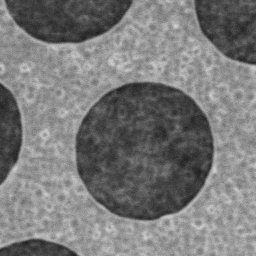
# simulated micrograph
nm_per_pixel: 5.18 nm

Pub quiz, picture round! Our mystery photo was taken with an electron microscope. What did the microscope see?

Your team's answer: holes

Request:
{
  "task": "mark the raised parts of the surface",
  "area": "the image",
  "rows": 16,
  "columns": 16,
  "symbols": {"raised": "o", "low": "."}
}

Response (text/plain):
........oooo....
o......ooooo....
oo....ooooooo...
oooooooooooooo..
oooooooooooooooo
ooooooo....ooooo
.ooooo......oooo
.oooo........ooo
.oooo........ooo
.oooo........ooo
.oooo........ooo
ooooo........ooo
oooooo......oooo
ooooooo...oooooo
oooooooooooooooo
....oooooooooooo